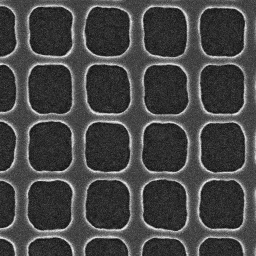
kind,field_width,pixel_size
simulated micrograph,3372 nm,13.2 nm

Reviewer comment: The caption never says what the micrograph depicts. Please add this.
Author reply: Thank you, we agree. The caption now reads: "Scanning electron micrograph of a regular array of holes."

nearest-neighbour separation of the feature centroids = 750 nm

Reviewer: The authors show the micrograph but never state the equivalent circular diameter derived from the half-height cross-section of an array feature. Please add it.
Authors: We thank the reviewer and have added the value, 669 nanometres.